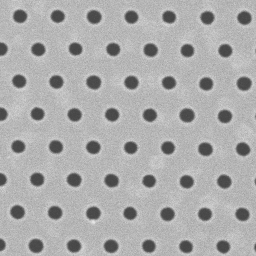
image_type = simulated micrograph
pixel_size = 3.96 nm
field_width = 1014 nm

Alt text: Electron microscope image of a regular array of holes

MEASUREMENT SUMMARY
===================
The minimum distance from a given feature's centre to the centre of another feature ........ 147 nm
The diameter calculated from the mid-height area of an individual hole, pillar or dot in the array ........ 54.2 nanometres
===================